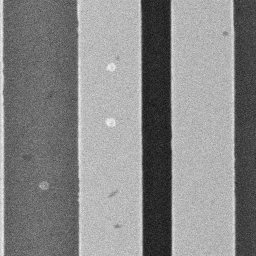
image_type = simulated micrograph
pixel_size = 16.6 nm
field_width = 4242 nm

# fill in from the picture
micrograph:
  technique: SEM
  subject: lines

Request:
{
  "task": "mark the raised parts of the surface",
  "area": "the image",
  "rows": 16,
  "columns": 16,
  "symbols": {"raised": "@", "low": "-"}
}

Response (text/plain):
-----@@@@--@@@@-
-----@@@@--@@@@-
-----@@@@--@@@@-
-----@@@@--@@@@-
-----@@@@--@@@@-
-----@@@@--@@@@-
-----@@@@--@@@@-
-----@@@@--@@@@-
-----@@@@--@@@@-
-----@@@@--@@@@-
-----@@@@--@@@@-
-----@@@@--@@@@-
-----@@@@--@@@@-
-----@@@@--@@@@-
-----@@@@--@@@@-
-----@@@@--@@@@-